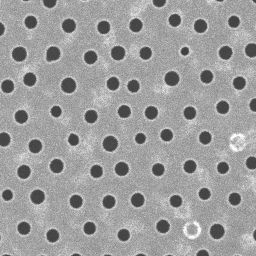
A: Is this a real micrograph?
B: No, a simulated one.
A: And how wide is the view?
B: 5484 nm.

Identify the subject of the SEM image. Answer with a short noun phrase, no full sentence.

a regular array of holes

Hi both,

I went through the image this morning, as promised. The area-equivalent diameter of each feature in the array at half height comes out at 295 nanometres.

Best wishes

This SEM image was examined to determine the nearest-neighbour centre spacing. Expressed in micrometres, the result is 0.62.